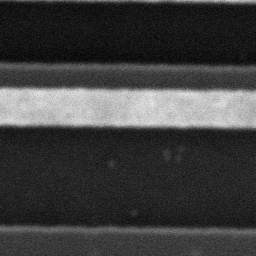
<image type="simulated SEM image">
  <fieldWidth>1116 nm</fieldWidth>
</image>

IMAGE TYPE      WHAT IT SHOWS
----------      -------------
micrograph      lines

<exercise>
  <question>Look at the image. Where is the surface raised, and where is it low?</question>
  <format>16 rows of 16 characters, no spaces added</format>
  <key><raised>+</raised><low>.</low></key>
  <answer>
................
................
................
................
++++++++++++++++
++++++++++++++++
++++++++++++++++
++++++++++++++++
................
................
................
................
................
................
++++++++++++++++
++++++++++++++++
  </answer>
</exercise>